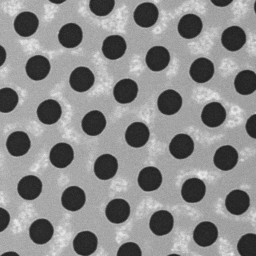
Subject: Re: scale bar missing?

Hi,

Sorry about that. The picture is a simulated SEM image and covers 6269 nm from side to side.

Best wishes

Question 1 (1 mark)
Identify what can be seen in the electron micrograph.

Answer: a regular array of holes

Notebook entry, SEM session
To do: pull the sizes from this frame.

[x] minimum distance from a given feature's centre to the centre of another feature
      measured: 1100 nm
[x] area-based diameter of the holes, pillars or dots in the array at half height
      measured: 0.625 µm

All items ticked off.